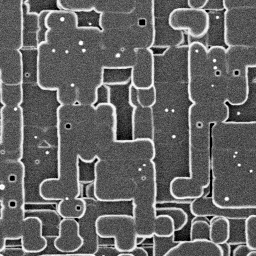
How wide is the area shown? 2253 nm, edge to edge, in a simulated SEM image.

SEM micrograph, wiring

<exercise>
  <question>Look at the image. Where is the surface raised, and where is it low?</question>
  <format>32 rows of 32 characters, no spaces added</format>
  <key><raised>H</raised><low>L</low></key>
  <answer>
HHHLLLLHHHHHHHHHHHHLLLLLHHLLHHHH
HHHLLLHHHHLLHHHHHHHLLLHHHHLLHHHH
HHHLLLHHHHLLLHHHHHHLLHHHHHLLHHHH
HHHLLLHHHHHHHHHHHHHLLLHHHHLLHHHH
HHHLLLHHHHHHHHHHHHHLLLLLHLLLHHHH
HHHLLHHHHHHHHHHHHHHLLLLLHLLLHHHH
HHHLLHHHHHHHHHHHHHHLLLLLHHHHHHHH
HHHLLHHHHHHHHHHHHHHLLLLLHHHHHHHH
HHHLLHHHHHHHHHHHHHHLLLLLHHHHHHHL
HHHLLHHHHHHHHLLLLHHLLLLLHHHHHHHL
HHHLLHHHHHHHHLLLLHHLLLLLHHHHHHHL
HHHLLLLHHHHHLLLLLLLLLLLLHHHHHHHL
HHHLLLLHHHHHLLLLLLLLLLLLHHHHHHHL
HHHLLLLHHHHHHHLLLLLLLLLLHHHHLLLL
HHHLLLLHHHHHHHLLLLLLLLLLHHHHLLLL
HHHLLLLHHHHHHHLLLLLLLLLLHHHHHHHH
HHHLLLLHHHHHHHLLLLLLLLLLHHHHHHHH
HHHLLLLHHHHHHHHLLHHLLLLLHHHHHHHH
HHHLLLLHHHHHHHHHHHHLLLLLHHHHHHHH
HHHLLLLHHHHHHHHHHHHLLLLLHHHHHHHH
HHHLLLLHHHLLHHHHHHHLLLLLHHHHHHHH
HHHLLLLHHHLLHHHHHHHLLLLLHHHHHHHH
HHHLLLHHHHLLHHHHHHHLLLHHHHHHHHHH
HHHLLHHHHHLLHHHHHHHLLHHHHHHHHHHH
HHHLLHHHHHLLHHHHHHHLLLHHHLLHHHHH
HHHLLLLHHHHLLLLLLHHLLLLLLLLHHHHH
HHHLLLLHHHHLLLLLLHHLLLLLLLLLLLLL
HHHHHLLLHHLLHHHHHHHHHLLLLLLHLLLH
HHHHHLLLHHLLHHHHHHHHHHLLLLHHLLLH
HHHHHLLHHHLLLHHHHHHLHLLLLLHHLLLH
HLLHHHLHHHLLLLHHHLLLLLHHHHHHLLLH
LLLLLLLLHLLLLLLHLLLLLHHHHHHHLLLH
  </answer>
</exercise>